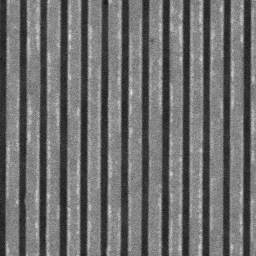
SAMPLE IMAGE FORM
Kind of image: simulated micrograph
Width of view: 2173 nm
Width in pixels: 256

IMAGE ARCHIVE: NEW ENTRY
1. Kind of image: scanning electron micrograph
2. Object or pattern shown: parallel lines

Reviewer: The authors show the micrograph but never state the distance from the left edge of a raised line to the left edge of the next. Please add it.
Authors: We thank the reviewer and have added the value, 20.4 pixels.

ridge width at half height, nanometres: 106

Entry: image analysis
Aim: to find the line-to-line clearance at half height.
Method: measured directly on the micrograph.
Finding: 67.9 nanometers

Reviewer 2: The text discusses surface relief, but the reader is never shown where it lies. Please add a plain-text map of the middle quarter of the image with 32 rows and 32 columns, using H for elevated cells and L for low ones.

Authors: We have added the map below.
LHHHLLHHHLLHHHLLLHHLLHHHLLLHHHLL
LHHHLLHHHLLHHHLLLHHLLHHHLLLHHHLL
LHHHLLHHHLLHHHLLHHHLLHHHLLLHHLLL
LHHHLLHHHLLHHHLLHHHLLHHHLLLHHLLL
LHHHLLHHHLLHHHLLHHHLLHHHLLLHHLLL
LHHHLLHHHLLHHHLLHHHLLHHHLLLHHLLL
LHHHLLHHHLLHHHLLHHHLLHHHLLLHHLLL
LHHHLLHHHLLHHHLLHHHLLHHHLLLHHLLL
LHHHLLHHHLLHHHLLHHHLLHHHLLLHHLLL
LHHHLLHHHLLHHHLLHHHLLHHHLLLHHLLL
LHHHLLHHHLLHHHLLHHHLLHHHLLLHHLLL
LHHHLLHHHLLHHHLLHHHLLHHHLLLHHLLL
LHHHLLHHHLLHHHLLHHHLLHHHLLLHHLLL
LHHHLLHHHLLHHHLLHHHLLHHHLLLHHLLL
LHHHLLHHHLLHHHLLHHHLLHHHLLLHHLLL
LHHHLLHHHLLHHHLLHHHLLHHHLLLHHLLL
LHHHLLHHHLLHHHLLHHHLLHHHLLLHHLLH
LHHHLLHHHLLHHHLLHHHLLHHHLLLHHLLH
LHHHLLHHHLLHHHLLHHHLLHHHLLLHHLLH
LHHHLLHHHLLHHHLLHHHLLHHHLLLHHLLH
LHHHLLHHHLLHHHLLHHHLLHHHLLLHHLLH
LHHHLLHHHLLHHHLLHHHLLHHHLLLHHLLH
LHHHLLHHHLLHHHLLHHHLLHHHLLLHHLLL
LHHHLLHHHLLHHHLLHHHLLHHHLLLHHLLL
LHHHLLHHHLLHHHLLHHHLLHHHLLLHHLLL
LHHHLLHHHLLHHHLLHHHLLHHHLLLHHLLL
LHHHLLHHHLLHHHLLHHHLLHHHLLLHHLLL
LHHHLLHHHLLHHHLLHHHLLHHHLLHHHLLL
LHHHLLHHHLLHHHLLHHHLLHHHLLHHHLLL
LHHHLLHHHLLHHHLLHHHLLHHHLLHHHLLL
LHHHLLHHHLLHHHLLHHHLLHHHLLHHHLLL
LHHHLLHHHLLHHHLLHHHLLHHHLLHHHLLL